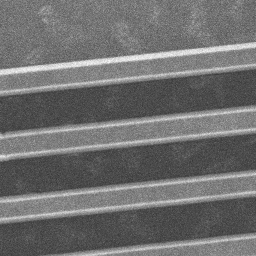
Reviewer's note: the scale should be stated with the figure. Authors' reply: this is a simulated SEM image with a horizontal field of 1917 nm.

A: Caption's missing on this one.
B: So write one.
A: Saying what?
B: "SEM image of parallel lines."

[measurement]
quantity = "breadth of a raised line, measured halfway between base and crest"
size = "0.17 microns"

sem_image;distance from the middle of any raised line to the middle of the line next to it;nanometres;474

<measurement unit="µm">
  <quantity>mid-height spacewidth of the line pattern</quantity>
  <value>0.301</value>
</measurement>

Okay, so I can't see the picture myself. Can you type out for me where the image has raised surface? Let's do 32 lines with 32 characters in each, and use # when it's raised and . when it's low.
................................
................................
................................
................................
................................
................................
.......................#########
..............##################
.....##########################.
######################..........
############....................
###.............................
................................
................................
......................##########
.............###################
....###########################.
######################..........
############....................
###.............................
................................
................................
......................##########
.............###################
....#########################...
#####################...........
############....................
##..............................
................................
...............................#
......................##########
............####################